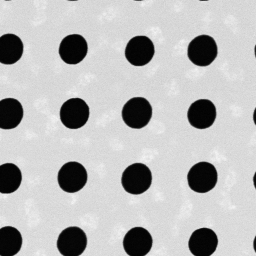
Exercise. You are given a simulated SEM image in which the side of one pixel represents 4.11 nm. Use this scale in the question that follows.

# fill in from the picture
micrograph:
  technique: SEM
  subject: a regular array of holes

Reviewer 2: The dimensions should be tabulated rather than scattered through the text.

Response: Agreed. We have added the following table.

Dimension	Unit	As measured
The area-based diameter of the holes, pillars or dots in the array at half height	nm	124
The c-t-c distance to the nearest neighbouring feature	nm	261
